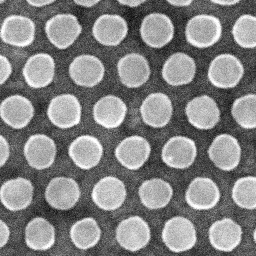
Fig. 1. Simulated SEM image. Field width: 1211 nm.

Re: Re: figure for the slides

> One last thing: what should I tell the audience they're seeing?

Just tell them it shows a regular array of raised bodies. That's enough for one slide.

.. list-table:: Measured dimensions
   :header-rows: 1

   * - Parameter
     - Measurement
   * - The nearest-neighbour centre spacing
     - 216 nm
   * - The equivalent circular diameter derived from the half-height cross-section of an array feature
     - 0.152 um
